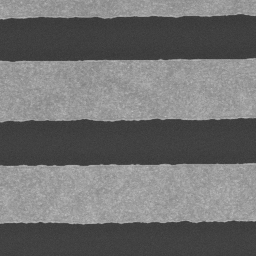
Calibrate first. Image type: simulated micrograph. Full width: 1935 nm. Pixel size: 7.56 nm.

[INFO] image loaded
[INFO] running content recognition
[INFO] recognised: lines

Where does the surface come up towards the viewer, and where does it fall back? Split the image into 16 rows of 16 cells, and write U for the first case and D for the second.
UUUUUUUUUUUUUUUU
DDDDDDDDDDDDDDDD
DDDDDDDDDDDDDDDD
DDDDDDDDDDDDDDDD
UUUUUUUUUUUUUUUU
UUUUUUUUUUUUUUUU
UUUUUUUUUUUUUUUU
UUUUUDUUUDDDDDDD
DDDDDDDDDDDDDDDD
DDDDDDDDDDDDDDDD
UUUUUUUUUUUUUUUU
UUUUUUUUUUUUUUUU
UUUUUUUUUUUUUUUU
UUUUUUUUUUUUUUUU
DDDDDDDDDDDDDDDD
DDDDDDDDDDDDDDDD